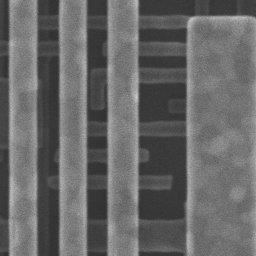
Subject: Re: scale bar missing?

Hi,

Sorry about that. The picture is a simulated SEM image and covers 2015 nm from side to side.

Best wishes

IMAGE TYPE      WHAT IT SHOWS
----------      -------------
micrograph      wiring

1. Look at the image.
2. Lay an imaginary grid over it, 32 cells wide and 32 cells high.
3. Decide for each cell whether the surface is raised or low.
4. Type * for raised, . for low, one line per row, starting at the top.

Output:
.****..****...***...............
.****..****...***...............
.****..****...***.......********
.****..****...***......*********
.****..****...***......*********
.****..****...***......*********
.****...***...***......*********
.****..****...***......*********
.****..****...***......*********
.****...***..****......*********
.****..****..****......*********
.****..****...***......*********
.****..****...***......*********
.****..****...***......*********
.****..****...***......*********
.****..****...***......*********
.****..****...***......*********
.****...***...***......*********
.****...***...***......*********
.****..****...***......*********
.****..****...***......*********
.****..****...***......*********
.****..****...***......*********
.****..****...***......*********
.****..****...***......*********
.***...****...***......*********
.****..****...***......*********
.****...***...***......*********
.****..****...***......*********
.****..****...***......*********
.****..****...***......*********
.****..****...***......*********